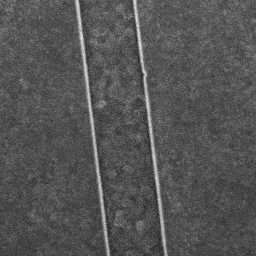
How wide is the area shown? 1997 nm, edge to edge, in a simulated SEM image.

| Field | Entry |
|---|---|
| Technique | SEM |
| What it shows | one or a few lines or trenches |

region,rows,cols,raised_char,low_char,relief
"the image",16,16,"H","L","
HHHHHLLLHHHHHHHH
HHHHHLLLLHHHHHHH
HHHHHLLLLHHHHHHH
HHHHHLLLLHHHHHHH
HHHHHLLLLHHHHHHH
HHHHHLLLLHHHHHHH
HHHHHHLLLHHHHHHH
HHHHHHLLLHHHHHHH
HHHHHHLLLHHHHHHH
HHHHHHLLLLHHHHHH
HHHHHHLLLLHHHHHH
HHHHHHLLLLHHHHHH
HHHHHHLLLLHHHHHH
HHHHHHLLLLHHHHHH
HHHHHHHLLLHHHHHH
HHHHHHHLLLHHHHHH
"